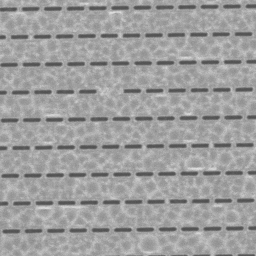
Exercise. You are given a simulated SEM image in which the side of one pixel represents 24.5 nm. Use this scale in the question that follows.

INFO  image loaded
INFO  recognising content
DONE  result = a regular array of holes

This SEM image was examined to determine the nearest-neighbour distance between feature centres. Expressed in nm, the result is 539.